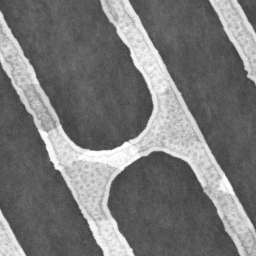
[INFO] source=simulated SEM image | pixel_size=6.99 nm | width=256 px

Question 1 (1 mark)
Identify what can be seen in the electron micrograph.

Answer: one or a few lines or trenches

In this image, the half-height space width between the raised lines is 589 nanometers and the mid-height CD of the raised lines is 21.3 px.